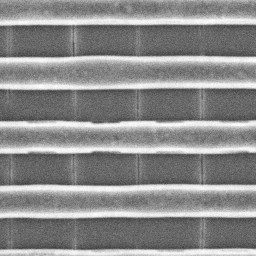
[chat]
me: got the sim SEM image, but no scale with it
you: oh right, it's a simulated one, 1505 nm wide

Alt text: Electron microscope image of wiring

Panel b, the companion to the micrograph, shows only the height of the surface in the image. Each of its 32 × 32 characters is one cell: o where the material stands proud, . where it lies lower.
oooooooooooooooooooooooooooooooo
oooooooooooooooooooooooooooooooo
oooooooooooooooooooooooooooooooo
................................
................................
................................
................................
oooooooooooooooooooooooooooooooo
oooooooooooooooooooooooooooooooo
oooooooooooooooooooooooooooooooo
oooooooooooooooooooooooooooooooo
................................
................................
................................
................................
oooo..oooo.....ooooo..oooooo..oo
oooooooooooooooooooooooooooooooo
oooooooooooooooooooooooooooooooo
oooooooooooooooooooooooooooooooo
................................
................................
................................
................................
.ooooooooooo...ooooooooooooooooo
oooooooooooooooooooooooooooooooo
oooooooooooooooooooooooooooooooo
oooooooooooooooooooooooooooooooo
................................
................................
................................
................................
.ooo...oo......ooooo...ooooooooo